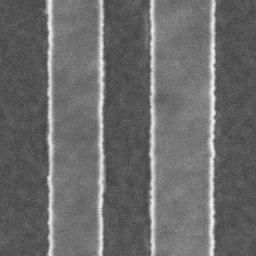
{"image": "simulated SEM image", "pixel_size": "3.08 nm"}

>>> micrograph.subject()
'lines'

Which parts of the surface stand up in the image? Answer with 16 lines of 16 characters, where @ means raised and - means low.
---@@@---@@@@---
---@@@---@@@@---
---@@@---@@@@---
---@@@---@@@@---
---@@@---@@@@---
---@@@---@@@@---
---@@@---@@@@---
---@@@---@@@@---
---@@@---@@@@---
---@@@---@@@@---
---@@@---@@@@---
---@@@---@@@@---
---@@@---@@@@---
---@@@---@@@@---
---@@@---@@@@---
---@@@---@@@@---